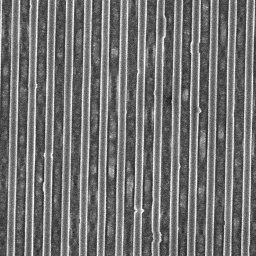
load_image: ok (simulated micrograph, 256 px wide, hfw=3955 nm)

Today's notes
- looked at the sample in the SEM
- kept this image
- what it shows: parallel lines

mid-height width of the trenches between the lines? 170 nm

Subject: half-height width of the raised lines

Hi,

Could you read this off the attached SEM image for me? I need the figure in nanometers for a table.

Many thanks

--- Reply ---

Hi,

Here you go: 114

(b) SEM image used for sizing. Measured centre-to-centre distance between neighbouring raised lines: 279 nm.